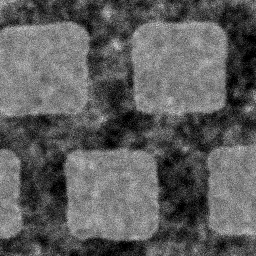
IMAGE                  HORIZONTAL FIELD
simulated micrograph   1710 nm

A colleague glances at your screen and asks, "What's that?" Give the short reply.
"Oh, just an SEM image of raised bodies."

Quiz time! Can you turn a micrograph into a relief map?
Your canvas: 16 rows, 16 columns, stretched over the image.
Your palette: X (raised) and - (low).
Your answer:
----------------
---XX----X--X---
XXXXXX--XXXXXX--
XXXXX---XXXXXX--
XXXXX---XXXXXX--
XXXXX---XXXXXX--
XXXXX----XXXXX--
----------------
----------------
X----XXXX----XXX
X---XXXXXX---XXX
X---XXXXXX---XXX
X---XXXXXX---XXX
X---XXXXXX---XXX
X----XXXXX----XX
----------------